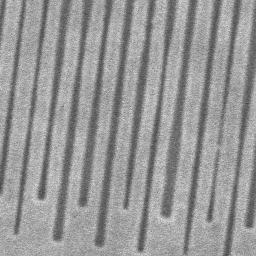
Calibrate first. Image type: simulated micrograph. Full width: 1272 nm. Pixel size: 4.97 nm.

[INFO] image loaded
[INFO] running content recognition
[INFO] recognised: parallel lines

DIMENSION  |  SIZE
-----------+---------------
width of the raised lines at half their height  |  69 nm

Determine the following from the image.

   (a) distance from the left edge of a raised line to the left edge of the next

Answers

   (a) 104 nm